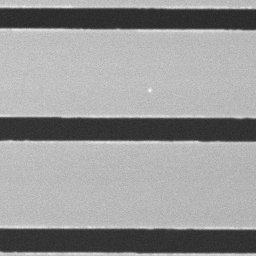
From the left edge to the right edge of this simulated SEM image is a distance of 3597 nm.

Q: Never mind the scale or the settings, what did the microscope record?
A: lines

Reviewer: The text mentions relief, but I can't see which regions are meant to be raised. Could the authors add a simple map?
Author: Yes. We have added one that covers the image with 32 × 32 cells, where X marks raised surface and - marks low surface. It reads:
XXXXXXXXXXXXXXXXXXXXXXXXXXXXXXXX
--------------------------------
--------------------------------
--------------------------------
XXXXXXXXXXXXXXXXXXXXXXXXXXXXXXXX
XXXXXXXXXXXXXXXXXXXXXXXXXXXXXXXX
XXXXXXXXXXXXXXXXXXXXXXXXXXXXXXXX
XXXXXXXXXXXXXXXXXXXXXXXXXXXXXXXX
XXXXXXXXXXXXXXXXXXXXXXXXXXXXXXXX
XXXXXXXXXXXXXXXXXXXXXXXXXXXXXXXX
XXXXXXXXXXXXXXXXXXXXXXXXXXXXXXXX
XXXXXXXXXXXXXXXXXXXXXXXXXXXXXXXX
XXXXXXXXXXXXXXXXXXXXXXXXXXXXXXXX
XXXXXXXXXXXXXXXXXXXXXXXXXXXXXXXX
XXXXXXXXXXXXXXXXXXXXXXXXXXXXXXXX
--------------------------------
--------------------------------
--------------------------------
XXXXXXXXXXXXXXXXXXXXXXXXXXXXXXXX
XXXXXXXXXXXXXXXXXXXXXXXXXXXXXXXX
XXXXXXXXXXXXXXXXXXXXXXXXXXXXXXXX
XXXXXXXXXXXXXXXXXXXXXXXXXXXXXXXX
XXXXXXXXXXXXXXXXXXXXXXXXXXXXXXXX
XXXXXXXXXXXXXXXXXXXXXXXXXXXXXXXX
XXXXXXXXXXXXXXXXXXXXXXXXXXXXXXXX
XXXXXXXXXXXXXXXXXXXXXXXXXXXXXXXX
XXXXXXXXXXXXXXXXXXXXXXXXXXXXXXXX
XXXXXXXXXXXXXXXXXXXXXXXXXXXXXXXX
------------------XX-XXXXXXXXXXX
--------------------------------
--------------------------------
--------------------------------